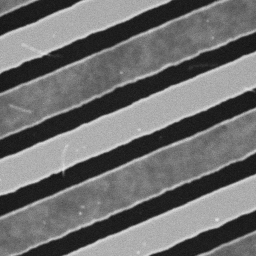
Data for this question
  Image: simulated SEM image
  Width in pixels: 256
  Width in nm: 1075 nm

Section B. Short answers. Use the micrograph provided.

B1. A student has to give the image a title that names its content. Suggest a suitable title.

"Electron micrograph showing lines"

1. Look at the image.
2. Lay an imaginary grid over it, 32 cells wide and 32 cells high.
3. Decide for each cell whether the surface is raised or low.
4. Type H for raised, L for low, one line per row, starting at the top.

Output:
HHHHLLLLLHHHHHHHHHHHHLLLLLHHHHHH
HLLLLLLHHHHHHHHHHHLLLLLLHHHHHHHH
LLLLLHHHHHHHHHHHLLLLLHHHHHHHHHHH
LLHHHHHHHHHHHHLLLLLHHHHHHHHHHHHH
HHHHHHHHHHHLLLLLLHHHHHHHHHHHHHHL
HHHHHHHHHLLLLLLHHHHHHHHHHHHHLLLL
HHHHHHLLLLLLHHHHHHHHHHHHHHLLLLLL
HHHHLLLLLLHHHHHHHHHHHHHLLLLLLHHH
HHLLLLLLHHHHHHHHHHHHHLLLLLLHHHHH
LLLLLHHHHHHHHHHHHHHLLLLLLHHHHHHH
LLLHHHHHHHHHHHHHLLLLLLHHHHHHHHHH
HHHHHHHHHHHHHHLLLLLLHHHHHHHHHHHL
HHHHHHHHHHHHLLLLLLHHHHHHHHHHLLLL
HHHHHHHHHLLLLLLHHHHHHHHHHHLLLLLL
HHHHHHHLLLLLLHHHHHHHHHHHLLLLLLHH
HHHHHLLLLLHHHHHHHHHHHLLLLLLHHHHH
HHLLLLLLHHHHHHHHHHHLLLLLLHHHHHHH
LLLLLLHHHHHHHHHHHLLLLLLHHHHHHHHH
LLLLHHHHHHHHHHLLLLLLHHHHHHHHHHHH
LHHHHHHHHHHHLLLLLLHHHHHHHHHHHHHL
HHHHHHHHHHLLLLLLHHHHHHHHHHHHHLLL
HHHHHHHHLLLLLHHHHHHHHHHHHHHLLLLL
HHHHHLLLLLLHHHHHHHHHHHHHLLLLLLHH
HHHLLLLLHHHHHHHHHHHHHHLLLLLLHHHH
LLLLLLHHHHHHHHHHHHHHLLLLLHHHHHHH
LLLLHHHHHHHHHHHHHLLLLLLHHHHHHHHH
LHHHHHHHHHHHHHHLLLLLLHHHHHHHHHHL
HHHHHHHHHHHHHLLLLLHHHHHHHHHHHLLL
HHHHHHHHHHLLLLLLHHHHHHHHHHHLLLLL
HHHHHHHHLLLLLLHHHHHHHHHHLLLLLLHH
HHHHHLLLLLLHHHHHHHHHHHLLLLLLHHHH
HHHLLLLLLHHHHHHHHHHHLLLLLLHHHHHH